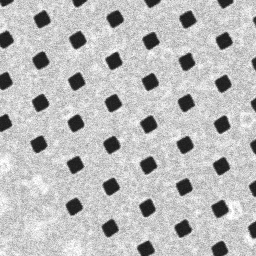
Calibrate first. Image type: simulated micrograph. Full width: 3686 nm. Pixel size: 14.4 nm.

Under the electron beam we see a regular array of holes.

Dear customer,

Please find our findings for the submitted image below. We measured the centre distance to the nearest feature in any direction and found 595 nm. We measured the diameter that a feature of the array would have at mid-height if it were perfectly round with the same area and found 239 nm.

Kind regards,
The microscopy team